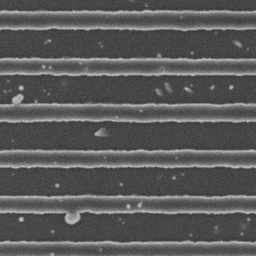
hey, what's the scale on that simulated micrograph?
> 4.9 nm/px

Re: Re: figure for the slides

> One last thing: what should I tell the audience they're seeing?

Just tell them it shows lines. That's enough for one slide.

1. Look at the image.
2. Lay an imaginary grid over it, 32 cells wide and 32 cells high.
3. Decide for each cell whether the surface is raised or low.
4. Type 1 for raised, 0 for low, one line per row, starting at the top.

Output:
00000000000000000000000000000000
11111111111111111111111111111111
11111111111111111111111111111111
11111111111111111111111111111111
00000000000000000000000000000000
00000000000000000000000000000000
00000000000000000000000000000000
11111111111111111111111111111111
11111111111111111111111111111111
00000000000000000000000000000000
00000000000000000000000000000000
00000000000000000000000000000000
00100000000000000000000000000000
11111111111111111111111111111111
11111111111111111111111111111111
00000000000000000000000000000000
00000000000000000000000000000000
00000000000000000000000000000000
00000000000000000000000000000000
11111111111111111111111111111111
11111111111111111111111111111111
00000000000000000000000000000000
00000000000000000000000000000000
00000000000000000000000000000000
00000000001100111000000100001010
11111111111111111111111111111111
11111111111111111011111111111111
00000000110000000000000000000000
00000000000000000000000000000000
00000000000000000000000000000000
11111111111111111111111111111111
11111111111111111111111111111111